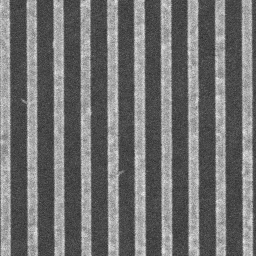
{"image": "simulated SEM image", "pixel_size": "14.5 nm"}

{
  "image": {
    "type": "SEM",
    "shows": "parallel lines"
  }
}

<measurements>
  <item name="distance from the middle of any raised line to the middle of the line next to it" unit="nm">389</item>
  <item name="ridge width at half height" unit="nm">116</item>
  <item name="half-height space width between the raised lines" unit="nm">273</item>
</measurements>